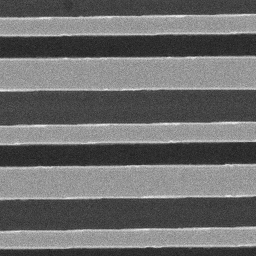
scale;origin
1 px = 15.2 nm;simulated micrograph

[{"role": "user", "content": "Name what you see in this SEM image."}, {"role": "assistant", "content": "lines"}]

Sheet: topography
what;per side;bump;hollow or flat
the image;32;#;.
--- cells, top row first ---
................................
................................
################################
################################
................................
................................
................................
################################
################################
################################
################################
................................
................................
................................
................................
....................############
################################
################################
................................
................................
................................
################################
################################
################################
###############################.
................................
................................
................................
...............................#
################################
################################
................................